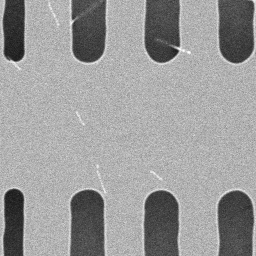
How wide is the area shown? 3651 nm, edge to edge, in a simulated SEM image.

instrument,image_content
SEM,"groups of lines, slits or small figures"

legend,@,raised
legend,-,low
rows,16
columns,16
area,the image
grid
--@@---@@--@@@--
--@@@--@@--@@@--
--@@@--@@--@@@--
-@@@@-@@@--@@@--
@@@@@@@@@@@@@@@@
@@@@@@@@@@@@@@@@
@@@@@@@@@@@@@@@@
@@@@@@@@@@@@@@@@
@@@@@@@@@@@@@@@@
@@@@@@@@@@@@@@@@
@@@@@@@@@@@@@@@@
@@@@@@@@@@@@@@@@
-@@@@-@@@--@@@--
-@@@---@@--@@@--
-@@@---@@--@@@--
-@@@---@@--@@@--